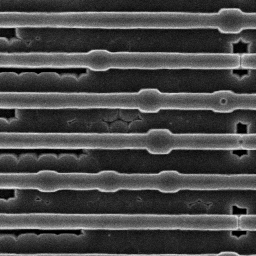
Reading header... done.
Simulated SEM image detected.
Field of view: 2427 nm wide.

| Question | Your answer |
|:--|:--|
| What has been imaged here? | wiring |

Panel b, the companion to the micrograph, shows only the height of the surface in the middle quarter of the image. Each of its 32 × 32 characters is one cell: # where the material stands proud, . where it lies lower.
################################
................................
................................
................................
................................
................................
...................#####........
################################
################################
################################
################################
...................#####........
................................
................................
................................
................................
......................####......
..##................#######.....
################################
################################
################################
.....................######.....
................................
................................
................................
................................
................................
###############........######...
################################
################################
################################
.........####...........#####...